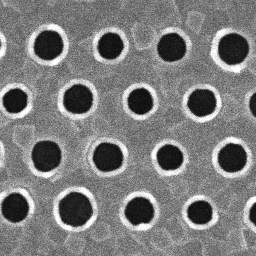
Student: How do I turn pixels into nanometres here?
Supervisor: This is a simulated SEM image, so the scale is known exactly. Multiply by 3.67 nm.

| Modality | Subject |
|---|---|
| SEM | a regular array of holes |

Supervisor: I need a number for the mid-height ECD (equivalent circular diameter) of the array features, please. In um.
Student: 0.107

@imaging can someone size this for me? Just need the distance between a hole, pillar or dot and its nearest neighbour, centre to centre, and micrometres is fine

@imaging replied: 0.226